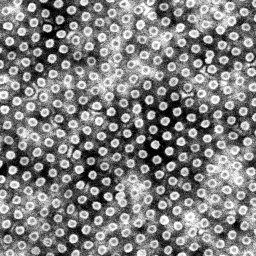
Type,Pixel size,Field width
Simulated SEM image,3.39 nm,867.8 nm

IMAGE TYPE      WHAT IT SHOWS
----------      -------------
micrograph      a regular array of raised bodies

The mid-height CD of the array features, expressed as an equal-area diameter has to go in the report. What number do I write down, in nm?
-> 26.3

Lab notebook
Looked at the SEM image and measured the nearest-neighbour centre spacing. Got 0.05 micrometres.